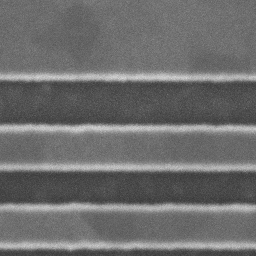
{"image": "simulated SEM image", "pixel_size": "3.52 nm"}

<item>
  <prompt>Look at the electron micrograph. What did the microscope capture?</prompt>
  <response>one or a few lines or trenches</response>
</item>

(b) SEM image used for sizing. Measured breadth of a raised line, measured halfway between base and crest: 139 nanometers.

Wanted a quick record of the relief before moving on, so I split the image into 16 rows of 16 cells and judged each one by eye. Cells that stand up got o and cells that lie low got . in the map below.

oooooooooooooooo
oooooooooooooooo
oooooooooooooooo
oooooooooooooooo
oooooooooooooooo
................
................
................
oooooooooooooooo
oooooooooooooooo
...o..o.o...ooo.
................
................
oooooooooooooooo
oooooooooooooooo
................